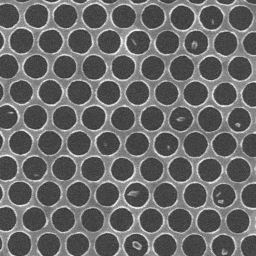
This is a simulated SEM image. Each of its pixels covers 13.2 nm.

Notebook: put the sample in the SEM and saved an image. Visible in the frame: a regular array of holes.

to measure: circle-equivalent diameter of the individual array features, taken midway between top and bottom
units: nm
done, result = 320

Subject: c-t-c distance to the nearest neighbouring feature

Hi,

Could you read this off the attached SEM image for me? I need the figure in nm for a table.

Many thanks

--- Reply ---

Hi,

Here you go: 382